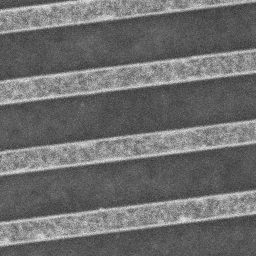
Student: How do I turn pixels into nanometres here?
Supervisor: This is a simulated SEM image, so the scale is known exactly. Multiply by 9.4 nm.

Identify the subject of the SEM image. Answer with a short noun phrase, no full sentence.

one or a few lines or trenches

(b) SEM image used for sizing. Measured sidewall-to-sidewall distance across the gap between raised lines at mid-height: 460 nm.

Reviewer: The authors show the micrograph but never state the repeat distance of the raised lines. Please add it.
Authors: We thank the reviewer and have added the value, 0.66 micrometres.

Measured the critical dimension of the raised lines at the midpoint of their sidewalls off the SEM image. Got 0.198 µm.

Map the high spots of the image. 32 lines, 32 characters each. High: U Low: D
DDDDDDDUUUUUUUUUUUUUUUUUUUUUUDDD
UUUUUUUUUUUUUUUUUUUUUDDDDDDDDDDD
UUUUUUUUUUUUUDDDDDDDDDDDDDDDDDDD
UUUUUDDDDDDDDDDDDDDDDDDDDDDDDDDD
DDDDDDDDDDDDDDDDDDDDDDDDDDDDDDDD
DDDDDDDDDDDDDDDDDDDDDDDDDDDDDDDD
DDDDDDDDDDDDDDDDDDDDDDDDDDDDDDUU
DDDDDDDDDDDDDDDDDDDDDDUUUUUUUUUU
DDDDDDDDDDDDDDUUUUUUUUUUUUUUUUUU
DDDDDDUUUUUUUUUUUUUUUUUUUUUDDDDD
UUUUUUUUUUUUUUUUUUUDDDDDDDDDDDDD
UUUUUUUUUUUUDDDDDDDDDDDDDDDDDDDD
UUUDDDDDDDDDDDDDDDDDDDDDDDDDDDDD
DDDDDDDDDDDDDDDDDDDDDDDDDDDDDDDD
DDDDDDDDDDDDDDDDDDDDDDDDDDDDDDDD
DDDDDDDDDDDDDDDDDDDDDDDDDDDDDUUU
DDDDDDDDDDDDDDDDDDDDDUUUUUUUUUUU
DDDDDDDDDDDDDUUUUUUUUUUUUUUUUUUU
DDDDDUUUUUUUUUUUUUUUUUUUUUDDDDDD
UUUUUUUUUUUUUUUUUUDDDDDDDDDDDDDD
UUUUUUUUUUDDDDDDDDDDDDDDDDDDDDDD
UUDDDDDDDDDDDDDDDDDDDDDDDDDDDDDD
DDDDDDDDDDDDDDDDDDDDDDDDDDDDDDDD
DDDDDDDDDDDDDDDDDDDDDDDDDDDDDDDD
DDDDDDDDDDDDDDDDDDDDDDDDDDDUUUUU
DDDDDDDDDDDDDDDDDDDUUUUUUUUUUUUU
DDDDDDDDDDDDUUUUUUUUUUUUUUUUUUUU
DDDDUUUUUUUUUUUUUUUUUUUUUDDDDDDD
UUUUUUUUUUUUUUUUUDDDDDDDDDDDDDDD
UUUUUUUUUDDDDDDDDDDDDDDDDDDDDDDD
UDDDDDDDDDDDDDDDDDDDDDDDDDDDDDDD
DDDDDDDDDDDDDDDDDDDDDDDDDDDDDDDD